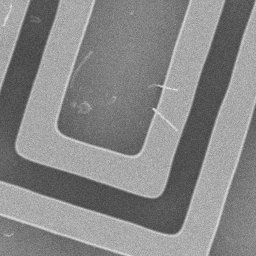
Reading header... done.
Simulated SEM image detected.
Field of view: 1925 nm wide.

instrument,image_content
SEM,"groups of lines, slits or small figures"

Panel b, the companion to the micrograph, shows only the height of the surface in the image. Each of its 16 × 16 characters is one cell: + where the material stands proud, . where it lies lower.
++..++......++..
+..++......+++.+
+..++......++..+
+..++......++..+
..++.......++..+
..++......++..++
..++......++..++
.+++......++.+++
.+++.....++..++.
.++++++..++..++.
...++++++++..++.
+......+++..++..
++++........++..
+++++++.....++..
...+++++++.++...
......+++++++...